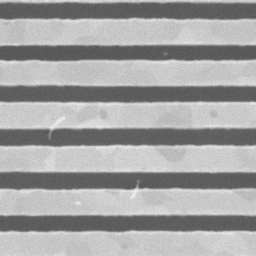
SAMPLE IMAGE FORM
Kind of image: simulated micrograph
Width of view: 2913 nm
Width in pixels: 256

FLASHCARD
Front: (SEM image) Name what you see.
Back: lines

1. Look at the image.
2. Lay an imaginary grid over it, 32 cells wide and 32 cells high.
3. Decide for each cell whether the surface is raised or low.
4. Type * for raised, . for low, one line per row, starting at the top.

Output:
................................
................................
**********************.*****..**
********************************
********************************
********************************
................................
...............................*
********************************
********************************
********************************
................................
................................
********************************
********************************
********************************
................................
................................
********************************
********************************
********************************
....**..*.*******..*****.*******
................................
................................
********************************
********************************
********************************
................................
................................
********************************
********************************
********************************